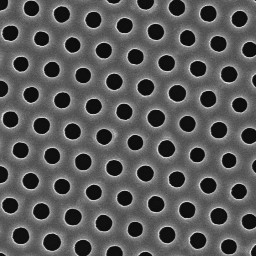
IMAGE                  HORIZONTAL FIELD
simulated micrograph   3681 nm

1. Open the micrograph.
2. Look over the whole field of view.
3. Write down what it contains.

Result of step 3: a regular array of holes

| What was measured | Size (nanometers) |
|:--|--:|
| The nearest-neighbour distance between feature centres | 455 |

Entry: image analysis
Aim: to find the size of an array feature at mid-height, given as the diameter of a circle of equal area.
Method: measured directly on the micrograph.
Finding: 0.233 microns